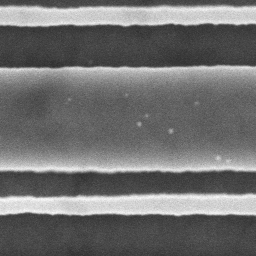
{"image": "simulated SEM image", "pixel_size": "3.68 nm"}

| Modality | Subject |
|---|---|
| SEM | lines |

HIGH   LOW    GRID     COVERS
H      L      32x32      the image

LLLLLLLLLLLLLLLLLLLLLLLLLLLLLLLL
HHHHHHHHHHHHHHHHHHHHHHHHHHHHHHHH
HHHHHHHHHHHHHHHHHHHHHHHHHHHHHHHH
LLLLLLLLLLLLLLLLLLLLLLLLLLLLLLLL
LLLLLLLLLLLLLLLLLLLLLLLLLLLLLLLL
LLLLLLLLLLLLLLLLLLLLLLLLLLLLLLLL
LLLLLLLLLLLLLLLLLLLLLLLLLLLLLLLL
LLLLLLLLLLLLLLLLLLLLLLLLLLLLLLLL
LLLLLLLLHHHHHHLHLLLLLHHHHHHHHHHH
HHHHHHHHHHHHHHHHHHHHHHHHHHHHHHHH
HHHHHHHHHHHHHHHHHHHHHHHHHHHHHHHH
HHHHHHHHHHHHHHHHHHHHHHHHHHHHHHHH
HHHHHHHHHHHHHHHHHHHHHHHHHHHHHHHH
HHHHHHHHHHHHHHHHHHHHHHHHHHHHHHHH
HHHHHHHHHHHHHHHHHHHHHHHHHHHHHHHH
HHHHHHHHHHHHHHHHHHHHHHHHHHHHHHHH
HHHHHHHHHHHHHHHHHHHHHHHHHHHHHHHH
HHHHHHHHHHHHHHHHHHHHHHHHHHHHHHHH
HHHHHHHHHHHHHHHHHHHHHHHHHHHHHHHH
HHHHHHHHHHHHHHHHHHHHHHHHHHHHHHHH
HHHHHHHHHHHHHHHHHHHHHHHHHHHHHHHH
LLLLLLLLLLLLLHLLLLLLLLLLLLLLLLLL
LLLLLLLLLLLLLLLLLLLLLLLLLLLLLLLL
LLLLLLLLLLLLLLLLLLLLLLLLLLLLLLLL
LLLLLLLLLLLLLLLLHLHHHHHHHHHHHHHH
HHHHHHHHHHHHHHHHHHHHHHHHHHHHHHHH
HHHLHHHHHHHHHHHHHHHHHHHHHHHHHHHH
LLLLLLLLLLLLLLLLLLLLLLLLLLLLLLLL
LLLLLLLLLLLLLLLLLLLLLLLLLLLLLLLL
LLLLLLLLLLLLLLLLLLLLLLLLLLLLLLLL
LLLLLLLLLLLLLLLLLLLLLLLLLLLLLLLL
LLLLLLLLLLLLLLLLLLLLLLLLLLLLLLLL